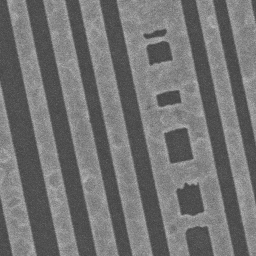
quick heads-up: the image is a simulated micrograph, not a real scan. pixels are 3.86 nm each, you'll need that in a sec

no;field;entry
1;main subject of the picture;parallel lines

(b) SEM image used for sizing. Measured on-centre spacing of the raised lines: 143 nm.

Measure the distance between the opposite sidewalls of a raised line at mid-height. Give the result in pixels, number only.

18.7